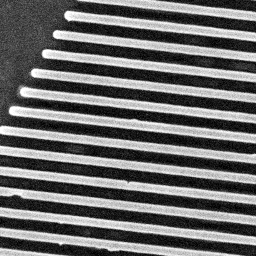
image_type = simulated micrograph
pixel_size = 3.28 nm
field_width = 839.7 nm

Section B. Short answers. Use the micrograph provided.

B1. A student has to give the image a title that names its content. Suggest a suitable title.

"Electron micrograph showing parallel lines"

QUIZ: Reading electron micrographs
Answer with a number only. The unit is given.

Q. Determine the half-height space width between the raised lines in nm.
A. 39.9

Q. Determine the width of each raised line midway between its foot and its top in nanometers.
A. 27.3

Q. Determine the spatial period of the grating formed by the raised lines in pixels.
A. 20.3